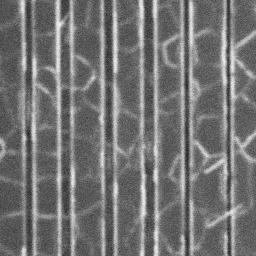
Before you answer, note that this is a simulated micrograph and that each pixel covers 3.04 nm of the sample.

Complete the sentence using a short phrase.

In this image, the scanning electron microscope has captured parallel lines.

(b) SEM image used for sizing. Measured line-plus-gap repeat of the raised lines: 123 nm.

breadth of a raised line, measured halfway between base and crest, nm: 88.1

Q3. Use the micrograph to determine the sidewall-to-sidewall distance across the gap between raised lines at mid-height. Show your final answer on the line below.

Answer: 30.4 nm